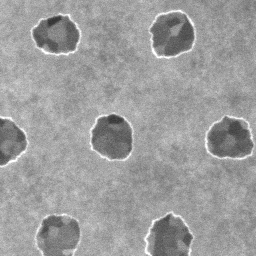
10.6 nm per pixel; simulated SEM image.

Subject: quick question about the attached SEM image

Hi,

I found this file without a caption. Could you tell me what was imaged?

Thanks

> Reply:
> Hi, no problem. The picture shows raised bodies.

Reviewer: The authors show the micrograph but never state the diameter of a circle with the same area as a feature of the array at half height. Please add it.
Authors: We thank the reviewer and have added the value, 484 nanometers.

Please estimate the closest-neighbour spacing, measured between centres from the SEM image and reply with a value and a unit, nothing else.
116 px